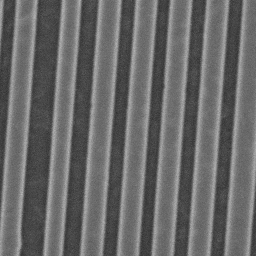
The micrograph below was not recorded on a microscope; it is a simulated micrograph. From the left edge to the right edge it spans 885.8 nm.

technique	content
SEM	parallel lines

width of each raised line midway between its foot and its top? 0.0756 micrometres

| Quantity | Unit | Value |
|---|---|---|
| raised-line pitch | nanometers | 131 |